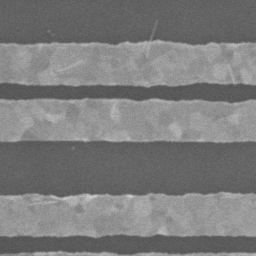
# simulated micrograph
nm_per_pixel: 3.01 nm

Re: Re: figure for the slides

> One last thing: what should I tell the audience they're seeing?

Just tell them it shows lines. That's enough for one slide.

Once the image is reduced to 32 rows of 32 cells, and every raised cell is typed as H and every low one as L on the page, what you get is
LLLLLLLLLLLLLLLLLLLLLLLLLLLLLLLL
LLLLLLLLLLLLLLLLLLLLLLLLLLLLLLLL
LLLLLLLLLLLLLLLLLLLLLLLLLLLLLLLL
LLLLLLLLLLLLLLLLLLLLLLLLLLLLLLLL
LLLLLLLLLLLLLLLLLLLLLLLLLLLLLLLL
LLLLLLHHLHLHHLLHHHHHHHHLLLHLLLHH
HHHHHHHHHHHHHHHHHHHHHHHHHHHHHHHH
HHHHHHHHHHHHHHHHHHHHHHHHHHHHHHHH
HHHHHHHHHHHHHHHHHHHHHHHHHHHHHHHH
HHHHHHHHHHHHHHHHHHHHHHHHHHHHHHHH
LLLHHHHHHHHHHHHHHHHHHHHHLLLLLLLH
LLLLLLLLLLLLLLLLLLLLLLLLLLLLLLLL
HLLLHHHLLLHHHHHHLLLHLLLLLLLLLLLL
HHHHHHHHHHHHHHHHHHHHHHHHHHHHHHHH
HHHHHHHHHHHHHHHHHHHHHHHHHHHHHHHH
HHHHHHHHHHHHHHHHHHHHHHHHHHHHHHHH
HHHHHHHHHHHHHHHHHHHHHHHHHHHHHHHH
HHHHHHHHHHHHHHHHHHHHHHHHHHHHHHHH
LLLLLLLLLLLLLLLLLLLLLLLLLLLLLLLL
LLLLLLLLLLLLLLLLLLLLLLLLLLLLLLLL
LLLLLLLLLLLLLLLLLLLLLLLLLLLLLLLL
LLLLLLLLLLLLLLLLLLLLLLLLLLLLLLLL
LLLLLLLLLLLLLLLLLLLLLLLLLLLLLLLL
LLLLLLLLLLLLLLLLLLLLLLLLLLLLLLLL
LLHHHLLLLLHHHHLHHLHHHLLHHHHHHHHH
HHHHHHHHHHHHHHHHHHHHHHHHHHHHHHHH
HHHHHHHHHHHHHHHHHHHHHHHHHHHHHHHH
HHHHHHHHHHHHHHHHHHHHHHHHHHHHHHHH
HHHHHHHHHHHHHHHHHHHHHHHHHHHHHHHH
HHLLHHHHHLLHHLLLLHHLLLHHHLHLLHHH
LLLLLLLLLLLLLLLLLLLLLLLLLLLLLLLL
LLLLLLLLLLLLLLLLLLLLLLLLLLLLLLLL